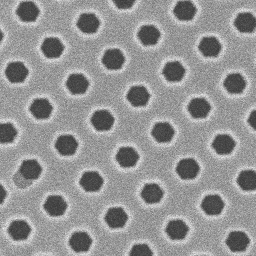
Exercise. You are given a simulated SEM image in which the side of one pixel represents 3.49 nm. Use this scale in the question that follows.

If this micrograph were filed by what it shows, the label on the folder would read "a regular array of holes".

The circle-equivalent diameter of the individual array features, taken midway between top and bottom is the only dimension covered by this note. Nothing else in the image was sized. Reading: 0.0842 microns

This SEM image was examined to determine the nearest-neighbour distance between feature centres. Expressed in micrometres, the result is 0.151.